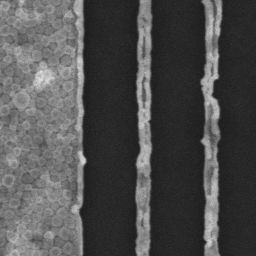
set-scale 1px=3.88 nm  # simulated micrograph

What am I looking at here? one or a few lines or trenches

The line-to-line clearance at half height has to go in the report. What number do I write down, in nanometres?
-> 216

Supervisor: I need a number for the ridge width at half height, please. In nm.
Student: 46.5